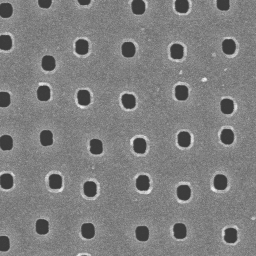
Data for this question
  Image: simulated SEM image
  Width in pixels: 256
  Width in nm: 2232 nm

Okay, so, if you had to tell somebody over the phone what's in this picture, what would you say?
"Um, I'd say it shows a regular array of holes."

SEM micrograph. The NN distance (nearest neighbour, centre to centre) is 331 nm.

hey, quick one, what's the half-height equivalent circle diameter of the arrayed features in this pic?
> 135 nm